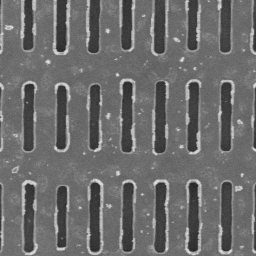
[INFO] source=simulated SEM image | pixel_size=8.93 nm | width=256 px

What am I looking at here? a regular array of holes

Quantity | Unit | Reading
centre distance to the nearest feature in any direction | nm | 293